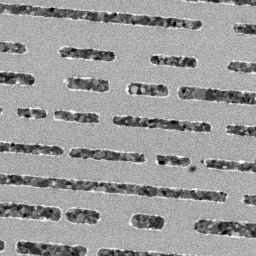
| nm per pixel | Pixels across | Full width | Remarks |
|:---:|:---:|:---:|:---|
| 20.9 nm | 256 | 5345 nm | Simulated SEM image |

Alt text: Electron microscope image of parallel lines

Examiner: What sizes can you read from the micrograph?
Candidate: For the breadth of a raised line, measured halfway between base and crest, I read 229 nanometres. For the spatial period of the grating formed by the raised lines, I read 698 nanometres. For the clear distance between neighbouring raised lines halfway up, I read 21.5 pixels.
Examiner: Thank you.